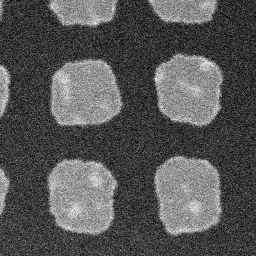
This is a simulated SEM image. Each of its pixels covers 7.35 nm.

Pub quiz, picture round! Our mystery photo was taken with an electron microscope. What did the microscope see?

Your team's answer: raised bodies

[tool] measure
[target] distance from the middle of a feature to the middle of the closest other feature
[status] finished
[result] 0.759 um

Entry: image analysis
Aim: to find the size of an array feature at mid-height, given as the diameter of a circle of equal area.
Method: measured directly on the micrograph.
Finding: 514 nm